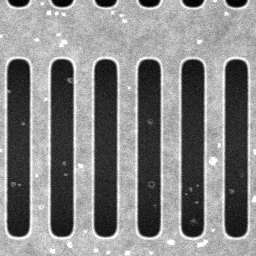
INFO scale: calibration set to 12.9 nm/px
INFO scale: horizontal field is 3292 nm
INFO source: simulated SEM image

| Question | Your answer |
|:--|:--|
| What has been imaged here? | groups of lines, slits or small figures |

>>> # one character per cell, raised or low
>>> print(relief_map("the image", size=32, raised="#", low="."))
#..####..###..####..###..####..#
################################
################################
################################
################################
################################
################################
##.####.####..####.####..####.##
#...##...###...##...###..###...#
#...##...###...##...###...##...#
#...##...###...##...###...##...#
#...##...###...##...###...##...#
#...##...###...##...###...##...#
#...##...###...##...###...##...#
#...##...###...##...###...##...#
#...##...###...##...###...##...#
#...##...###...##...###...##...#
#...##...###...##...###...##...#
#...##...###...##...###...##...#
#...##...###...##...###...##...#
#...##...###...##...###...##...#
#...##...###...##...###...##...#
#...##...###...##...###...##...#
#...##...###...##...###...##...#
#...##...###...##...###...##...#
#...##...###...##...###...##...#
#...##...###...##...###...##...#
#...##...###...##...###...##...#
#...##...###...##...###..###...#
##.####.####..####.####..####.##
################################
################################